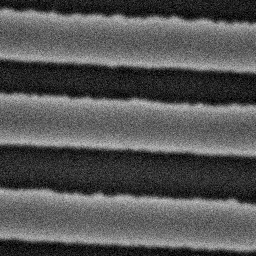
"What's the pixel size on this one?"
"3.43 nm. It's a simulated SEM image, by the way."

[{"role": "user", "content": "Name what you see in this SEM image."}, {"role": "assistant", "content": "lines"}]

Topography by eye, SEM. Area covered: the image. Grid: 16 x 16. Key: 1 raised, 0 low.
0000000000000000
1111111111111110
1111111111111111
1111111111111111
0000000000000000
0000000000000000
1111111111000000
1111111111111111
1111111111111111
0000000000001111
0000000000000000
0000000000000000
1111111111100000
1111111111111111
1111111111111111
0000000000001111